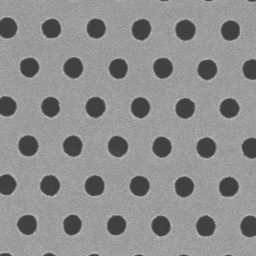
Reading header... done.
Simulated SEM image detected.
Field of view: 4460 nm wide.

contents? a regular array of holes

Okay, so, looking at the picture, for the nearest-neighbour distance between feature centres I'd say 773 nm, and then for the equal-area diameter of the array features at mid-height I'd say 0.36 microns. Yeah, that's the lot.